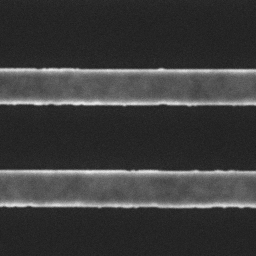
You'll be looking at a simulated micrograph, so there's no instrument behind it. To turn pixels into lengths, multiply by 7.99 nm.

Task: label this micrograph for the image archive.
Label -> lines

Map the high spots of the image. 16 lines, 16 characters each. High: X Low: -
----------------
----------------
----------------
----------------
XXXXXXXXXXXXXXXX
XXXXXXXXXXXXXXXX
--XXXXXXXXXXXXXX
----------------
----------------
----------------
----------------
XXXXXXXXXXXXXXXX
XXXXXXXXXXXXXXXX
----------------
----------------
----------------